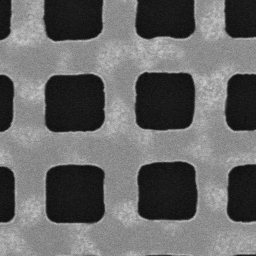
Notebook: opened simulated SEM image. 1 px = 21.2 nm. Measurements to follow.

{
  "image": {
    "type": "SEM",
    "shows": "holes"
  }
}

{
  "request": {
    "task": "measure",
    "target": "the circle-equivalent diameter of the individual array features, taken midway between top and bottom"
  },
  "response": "1370 nanometres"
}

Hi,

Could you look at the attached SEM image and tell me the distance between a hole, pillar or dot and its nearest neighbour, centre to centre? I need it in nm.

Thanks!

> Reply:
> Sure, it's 1920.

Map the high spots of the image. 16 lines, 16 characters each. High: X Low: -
-XX---XXX---XX--
-XX---XX----XX--
XXX--XXXXXXXXXXX
XXXXXXXXXXXXXXXX
XXXXXXXXXXXXXXXX
-XX----X----XX--
-XX----X----XX--
-XX---XXX---XX--
XXXXXXXXXXXXXXXX
XXXXXXXXXXXXXXXX
XXX---XXX---XXX-
-XX----XX---XX--
-XX----XX---XX--
-XX---XXX---XX--
XXXXXXXXXXXXXXXX
XXXXXXXXXXXXXXXX